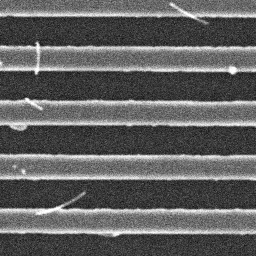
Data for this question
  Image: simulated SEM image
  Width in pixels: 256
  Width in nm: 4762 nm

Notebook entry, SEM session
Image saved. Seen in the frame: lines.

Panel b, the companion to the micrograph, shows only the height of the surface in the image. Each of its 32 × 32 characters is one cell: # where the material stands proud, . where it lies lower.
################################
################################
................................
................................
................................
................................
################################
################################
################################
................................
................................
................................
...#............................
################################
################################
################################
................................
................................
................................
################################
################################
################################
................................
................................
................................
................................
################################
################################
################################
................................
................................
................................